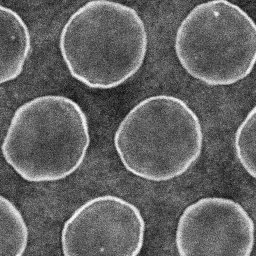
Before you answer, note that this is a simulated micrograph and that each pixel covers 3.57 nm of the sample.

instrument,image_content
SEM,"raised bodies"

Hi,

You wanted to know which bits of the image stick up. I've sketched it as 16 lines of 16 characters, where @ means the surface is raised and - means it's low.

-----@@@----@@@-
@---@@@@@--@@@@@
@@--@@@@@--@@@@@
@@--@@@@@--@@@@@
@---@@@@----@@@@
----------------
--@@@----@@-----
-@@@@---@@@@---@
@@@@@@-@@@@@@--@
@@@@@--@@@@@---@
-@@@@---@@@@---@
----------------
------@@-----@--
@----@@@@--@@@@-
@@--@@@@@--@@@@@
@---@@@@@--@@@@@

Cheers